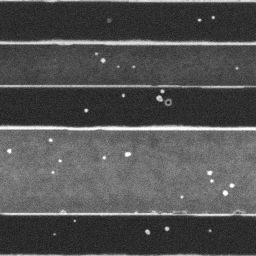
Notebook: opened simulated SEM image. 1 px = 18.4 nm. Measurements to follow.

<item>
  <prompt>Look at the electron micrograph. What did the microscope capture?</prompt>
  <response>lines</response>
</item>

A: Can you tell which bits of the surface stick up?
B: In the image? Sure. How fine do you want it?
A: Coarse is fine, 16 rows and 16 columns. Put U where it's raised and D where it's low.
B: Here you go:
UUUUUUUUUUUUUUUU
UUUUUUUUUUUUUUUU
UUUUUUUUUUUUUUUU
DDDDDDDDDDDDDDDD
DDDDDDDDDDDDDDDD
UUUUUUUUUUUUUUUU
UUUUUUUUUUUUUUUU
UUUUUUUUUUUUUUUU
DDDDDDDDDDDDDDDD
DDDDDDDDDDDDDDDD
DDDDDDDDDDDDDDDD
DDDDDDDDDDDDDDDD
DDDDDDDDDDDDDDDD
UUUUUUUUUUUUUUUU
UUUUUUUUUUUUUUUU
UUUUUUUUUUUUUUUU